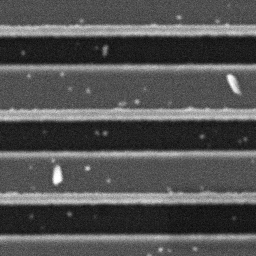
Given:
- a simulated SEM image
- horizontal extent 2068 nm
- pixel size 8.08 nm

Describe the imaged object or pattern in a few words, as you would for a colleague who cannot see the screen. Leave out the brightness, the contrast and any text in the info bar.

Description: lines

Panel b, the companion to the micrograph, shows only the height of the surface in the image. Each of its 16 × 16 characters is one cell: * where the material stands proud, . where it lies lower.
****************
****************
................
................
****************
****************
****************
................
................
................
****************
****************
****************
................
................
****************